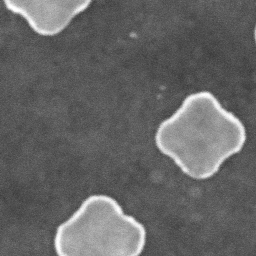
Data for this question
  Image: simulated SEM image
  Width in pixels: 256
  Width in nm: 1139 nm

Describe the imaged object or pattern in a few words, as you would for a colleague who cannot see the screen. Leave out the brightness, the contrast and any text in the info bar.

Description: raised bodies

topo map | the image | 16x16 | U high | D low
DUUUUDDDDDDDDDDD
DDUUDDDDDDDDDDDD
DDDDDDDDDDDDDDDD
DDDDDDDDDDDDDDDD
DDDDDDDDDDDDDDDD
DDDDDDDDDDDDDDDD
DDDDDDDDDDDUUUDD
DDDDDDDDDDUUUUUD
DDDDDDDDDDUUUUUD
DDDDDDDDDDUUUUUD
DDDDDDDDDDDUUUDD
DDDDDDDDDDDDDDDD
DDDDDDUDDDDDDDDD
DDDDDUUUDDDDDDDD
DDDDUUUUUDDDDDDD
DDDDUUUUUDDDDDDD